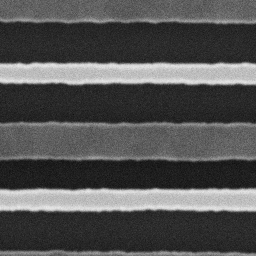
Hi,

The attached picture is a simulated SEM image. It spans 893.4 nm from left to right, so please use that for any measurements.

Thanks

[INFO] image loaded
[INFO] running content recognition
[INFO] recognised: lines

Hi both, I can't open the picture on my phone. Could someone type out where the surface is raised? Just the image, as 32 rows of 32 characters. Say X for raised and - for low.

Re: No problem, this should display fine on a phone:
XXXXXXXXXXXXXXXXXXXXXXXXXXXXXXXX
XXXXXXXXXXXXXXXXXXXXXXXXXXXXXXXX
XXXXXXXXXXXXXXXXXXXXXXXXXXXXXXXX
--------------------------------
--------------------------------
--------------------------------
--------------------------------
--------------------------------
XXXXXXXXXXXXXXXXXXXXXXXXXXXXXXXX
XXXXXXXXXXXXXXXXXXXXXXXXXXXXXXXX
--------XXX------------XX-XXXXXX
--------------------------------
--------------------------------
--------------------------------
--------------------------------
XXXXXXXXXXXXXX-XX-XXXXXXXXXX-XXX
XXXXXXXXXXXXXXXXXXXXXXXXXXXXXXXX
XXXXXXXXXXXXXXXXXXXXXXXXXXXXXXXX
XXXXXXXXXXXXXXXXXXXXXXXXXXXXXXXX
XXXXXXXXXXXXXXXXXXXXXXXXXXXXXXXX
--------------------------------
--------------------------------
--------------------------------
--------------------------------
XXXXXXXXXXXXXXXXXXXXXXXXXXXXXXXX
XXXXXXXXXXXXXXXXXXXXXXXXXXXXXXXX
--------------------------------
--------------------------------
--------------------------------
--------------------------------
--------------------------------
XXXXXXXXXXXXXXXX---XX-----X-----